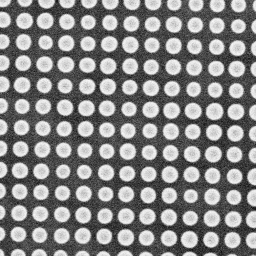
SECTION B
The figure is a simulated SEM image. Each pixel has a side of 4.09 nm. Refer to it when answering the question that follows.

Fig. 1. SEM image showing an array of small figures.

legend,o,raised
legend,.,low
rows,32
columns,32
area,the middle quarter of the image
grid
oo..oooo.oooo..ooo..ooo...ooo..o
oo...oo..oooo..ooo..ooo...ooo..o
................................
................................
oo..ooo...oo...ooo...oo.........
oo..oooo.oooo..ooo..ooo..oooo..o
oo..ooo..oooo..ooo..ooo..oooo..o
..........o..........oo...oo...o
................................
o....oo...oo....................
oo..ooo..ooo...ooo..ooo..ooo...o
oo..ooo..ooo...ooo..ooo..oooo.oo
o...ooo...oo...oo...ooo..oooo..o
................................
.....o..........................
oo..ooo..ooo...oo...ooo..ooo...o
oo..ooo..ooo..oooo..ooo..oooo.oo
o...ooo..ooo..oooo..ooo..oooo.oo
..........................oo...o
................................
o...oo....oo...oo.........o.....
oo..ooo..ooo..oooo..ooo..ooo..oo
o...ooo..ooo..oooo..ooo..ooo..oo
..........o....oo...oo...ooo..oo
................................
o...oo....o.....................
o...ooo..ooo..ooo...ooo..ooo..oo
o...ooo..ooo..ooo..oooo..ooo..oo
....oo...ooo..ooo...ooo..ooo..oo
................................
................................
o..oooo..ooo..ooo...oo...oo.....